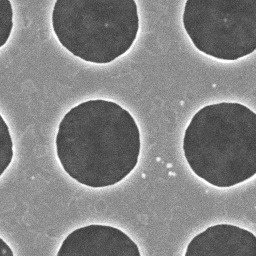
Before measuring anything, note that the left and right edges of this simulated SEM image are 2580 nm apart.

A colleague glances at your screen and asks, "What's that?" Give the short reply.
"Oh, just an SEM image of holes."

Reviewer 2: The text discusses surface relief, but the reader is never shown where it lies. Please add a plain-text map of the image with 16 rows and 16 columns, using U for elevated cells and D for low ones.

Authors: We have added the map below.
DUUDDDDDDUUUDDDD
DUUDDDDDDUUDDDDD
UUUUDDDDUUUUDDDD
UUUUUDDUUUUUUDDU
UUUUUUUUUUUUUUUU
UUUUUUUUUUUUUUUU
UUUUUDDUUUUUUDDU
UUUUDDDDUUUUDDDD
DUUUDDDDDUUUDDDD
DUUUDDDDDUUDDDDD
UUUUDDDDUUUUDDDD
UUUUUDDUUUUUUDDU
UUUUUUUUUUUUUUUU
UUUUUUUUUUUUUUUU
UUUUUDDDUUUUUDDD
DUUUDDDDDUUUDDDD